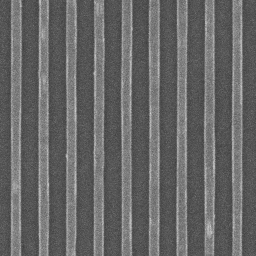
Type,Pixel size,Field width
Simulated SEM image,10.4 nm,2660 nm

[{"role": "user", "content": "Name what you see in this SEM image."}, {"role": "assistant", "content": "parallel lines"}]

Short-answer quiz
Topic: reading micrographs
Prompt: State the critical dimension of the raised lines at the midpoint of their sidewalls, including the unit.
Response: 97.4 nm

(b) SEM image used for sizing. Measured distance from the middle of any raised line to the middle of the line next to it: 287 nanometers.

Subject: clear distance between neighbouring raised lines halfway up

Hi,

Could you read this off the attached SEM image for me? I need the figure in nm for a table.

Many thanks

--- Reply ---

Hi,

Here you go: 186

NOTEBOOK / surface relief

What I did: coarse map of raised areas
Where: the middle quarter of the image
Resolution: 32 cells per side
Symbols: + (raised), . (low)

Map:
.++.....++.....++....+++.....++.
.++.....++....+++....+++.....++.
.++....+++....+++....+++.....++.
.++.....++....+++....+++.....+..
.++.....++....+++....+++.....+..
.++.....++....+++....+++.....+..
.++.....++....+++....+++.....+..
.++.....++....+++....+++.....+..
.++.....++....+++....+++.....+..
.++.....++....+++....+++.....+..
.++.....++....+++....+++.....+..
.++.....++....+++....+++.....++.
.++.....++....+++....+++.....++.
.++.....++....+++....+++....+++.
.++.....++....+++....+++....+++.
.++.....++....+++....+++....+++.
.++.....++....+++....+++....+++.
.++.....++.....++....+++....+++.
.++.....++.....++....+++....+++.
.++.....++.....++....+++....+++.
.++.....++.....++....+++....+++.
.++.....++.....++....+++....+++.
.++.....++.....++....+++....+++.
.++.....++.....++....+++....+++.
.++.....++.....++....+++....+++.
.++.....++.....++....+++....+++.
.++.....++.....++....+++....+++.
.++.....++.....++....+++....+++.
.++.....++.....++....+++....+++.
.++.....++.....++....+++....+++.
.++.....++.....++....+++....+++.
.++.....++.....++....+++....+++.